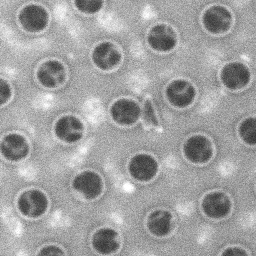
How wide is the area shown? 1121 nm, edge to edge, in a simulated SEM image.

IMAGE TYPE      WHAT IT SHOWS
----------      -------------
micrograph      a regular array of raised bodies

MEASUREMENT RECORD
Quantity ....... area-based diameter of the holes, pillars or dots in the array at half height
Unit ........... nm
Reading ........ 144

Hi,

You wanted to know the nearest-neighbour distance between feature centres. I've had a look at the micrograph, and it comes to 253 nm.